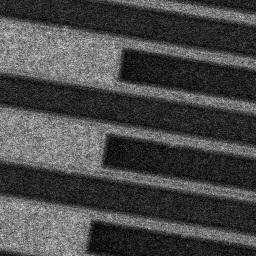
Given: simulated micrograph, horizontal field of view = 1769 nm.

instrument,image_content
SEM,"parallel lines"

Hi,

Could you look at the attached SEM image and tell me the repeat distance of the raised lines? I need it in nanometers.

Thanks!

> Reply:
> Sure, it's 302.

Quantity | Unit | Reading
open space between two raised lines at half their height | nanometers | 224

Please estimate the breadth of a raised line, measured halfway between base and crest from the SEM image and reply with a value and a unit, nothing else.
0.0751 um